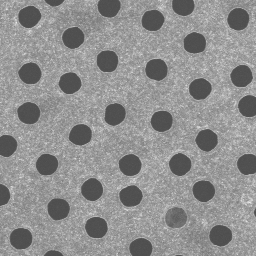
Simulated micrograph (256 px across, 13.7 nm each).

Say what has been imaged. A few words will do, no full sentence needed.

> a regular array of holes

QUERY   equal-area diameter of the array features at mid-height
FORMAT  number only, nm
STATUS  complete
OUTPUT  303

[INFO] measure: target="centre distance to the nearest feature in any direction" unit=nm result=566